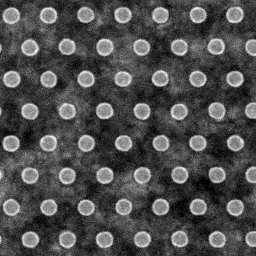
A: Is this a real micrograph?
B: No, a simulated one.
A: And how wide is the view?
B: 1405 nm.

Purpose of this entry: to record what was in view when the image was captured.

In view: a regular array of raised bodies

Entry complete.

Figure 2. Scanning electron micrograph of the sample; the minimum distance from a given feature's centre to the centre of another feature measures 201 nm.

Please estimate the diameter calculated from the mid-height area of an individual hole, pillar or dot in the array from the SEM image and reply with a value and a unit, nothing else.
85.6 nm